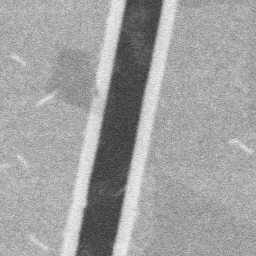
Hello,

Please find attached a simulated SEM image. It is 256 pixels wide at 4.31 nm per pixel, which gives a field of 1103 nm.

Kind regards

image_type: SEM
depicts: one or a few lines or trenches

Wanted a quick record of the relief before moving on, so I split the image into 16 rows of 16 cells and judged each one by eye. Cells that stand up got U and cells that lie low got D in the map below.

UUUUUUUDDDDUUUUU
UUUUUUUDDDUUUUUU
UUUUUUUDDDUUUUUU
UUUUUUUDDDUUUUUU
UUUUUUUDDDUUUUUU
UUUUUUDDDUUUUUUU
UUUUUUDDDUUUUUUU
UUUUUUDDDUUUUUUU
UUUUUUDDDUUUUUUU
UUUUUUDDDUUUUUUU
UUUUUDDDDUUUUUUU
UUUUUDDDUUUUUUUU
UUUUUDDDUUUUUUUU
UUUUUDDDUUUUUUUU
UUUUUDDDUUUUUUUU
UUUUDDDUUUUUUUUU